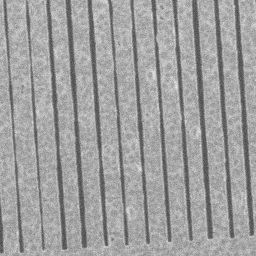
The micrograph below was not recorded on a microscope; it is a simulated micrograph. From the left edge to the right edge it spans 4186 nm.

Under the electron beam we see parallel lines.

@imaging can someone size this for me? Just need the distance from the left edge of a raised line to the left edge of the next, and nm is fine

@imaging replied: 343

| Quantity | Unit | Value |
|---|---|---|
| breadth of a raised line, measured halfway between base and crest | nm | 253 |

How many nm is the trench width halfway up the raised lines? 79.5